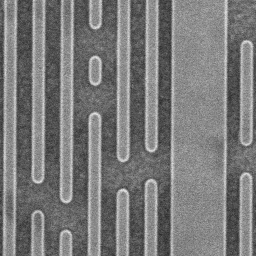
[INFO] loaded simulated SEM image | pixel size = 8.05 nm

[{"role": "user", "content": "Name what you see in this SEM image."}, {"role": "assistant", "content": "groups of lines, slits or small figures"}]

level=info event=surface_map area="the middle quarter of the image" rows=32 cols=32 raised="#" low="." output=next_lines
##....###....###.....##....#####
##....###....###.....##....#####
##....###....###.....##....#####
##....###....###.....##....#####
##.....##....###.....##....#####
##...........###.....##....#####
##...........###.....##....#####
##...........###.....##....#####
##...........###.....##....#####
##...........###.....##....#####
##...........###.....##....#####
##...........###.....##....#####
##.....##....###.....##....#####
##....###....###.....##....#####
##....###....###.....##....#####
##....###....###.....##....#####
##....###....###.....##....#####
##....###....###.....##....#####
##....###....###.....##....#####
##....###....###.....##....#####
##....###....###.....##....#####
##....###....###.....##....#####
##....###....###...........#####
##....###....###...........#####
##....###..................#####
##....###..................#####
##....###..................#####
##....###..................#####
##....###..................#####
##....###............##....#####
##....###...........###....#####
##....###...........###....#####